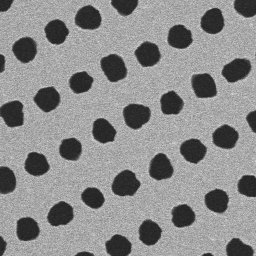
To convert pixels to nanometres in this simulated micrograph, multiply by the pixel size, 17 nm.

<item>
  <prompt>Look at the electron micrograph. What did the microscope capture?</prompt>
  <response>a regular array of holes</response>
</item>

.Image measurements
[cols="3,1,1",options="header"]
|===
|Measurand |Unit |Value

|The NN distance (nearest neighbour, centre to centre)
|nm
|613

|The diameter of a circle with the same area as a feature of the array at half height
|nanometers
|412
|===